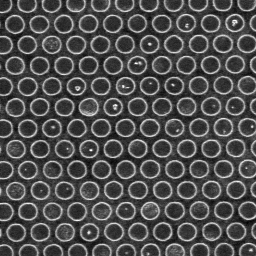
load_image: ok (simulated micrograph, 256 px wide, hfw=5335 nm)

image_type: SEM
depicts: a regular array of raised bodies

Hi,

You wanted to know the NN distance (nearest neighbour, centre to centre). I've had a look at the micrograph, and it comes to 498 nm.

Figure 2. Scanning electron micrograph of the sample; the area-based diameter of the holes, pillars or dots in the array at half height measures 370 nm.